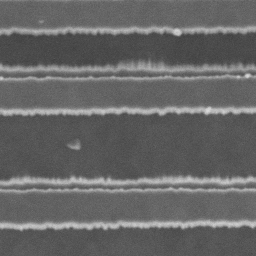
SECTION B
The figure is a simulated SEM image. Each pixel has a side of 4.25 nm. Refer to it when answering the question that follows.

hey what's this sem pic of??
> lines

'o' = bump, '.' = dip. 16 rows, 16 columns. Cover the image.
oooooooooooooooo
oooooooooooooooo
................
................
oooooooooooooooo
oooooooooooooooo
oooooooooooooooo
................
................
................
................
oooooooooooooooo
oooooooooooooooo
oooooooooooooooo
................
................